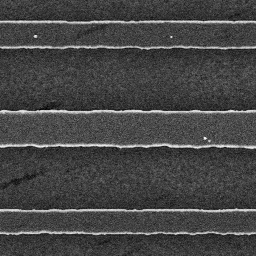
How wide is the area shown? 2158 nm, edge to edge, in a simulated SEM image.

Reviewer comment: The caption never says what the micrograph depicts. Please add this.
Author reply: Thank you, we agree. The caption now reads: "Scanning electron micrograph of lines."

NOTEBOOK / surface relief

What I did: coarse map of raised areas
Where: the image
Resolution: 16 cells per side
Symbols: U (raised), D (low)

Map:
DDDDDDDDDDDDDDDD
UUUUUUUUUUUUUUUU
UUUUUUUUUUUUUUUU
DDDDDDDDDDDDDDDD
DDDDDDDDDDDDDDDD
DDDDDDDDDDDDDDDD
DDDDDDDDDDDDDDDD
UUUUUUUUUUUUUUUU
UUUUUUUUUUUUUUUU
DDDDDDDDDDDDDDDD
DDDDDDDDDDDDDDDD
DDDDDDDDDDDDDDDD
DDDDDDDDDDDDDDDD
UUUUUUUUUUUUUUUU
UUUUUUUUUUUUUUUU
DDDDDDDDDDDDDDDD